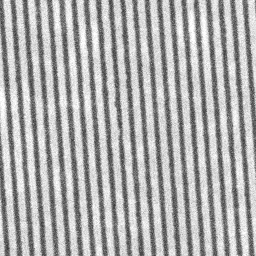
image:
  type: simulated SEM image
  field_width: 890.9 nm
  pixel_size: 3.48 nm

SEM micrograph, parallel lines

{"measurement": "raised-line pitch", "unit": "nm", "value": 42.4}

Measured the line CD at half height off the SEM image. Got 20.8 nm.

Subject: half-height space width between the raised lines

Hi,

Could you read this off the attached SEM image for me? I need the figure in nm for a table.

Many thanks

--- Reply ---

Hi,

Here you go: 20.4